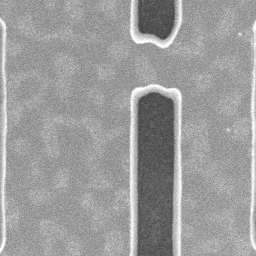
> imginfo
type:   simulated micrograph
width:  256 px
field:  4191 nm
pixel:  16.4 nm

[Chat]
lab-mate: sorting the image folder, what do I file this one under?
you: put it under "one or a few lines or trenches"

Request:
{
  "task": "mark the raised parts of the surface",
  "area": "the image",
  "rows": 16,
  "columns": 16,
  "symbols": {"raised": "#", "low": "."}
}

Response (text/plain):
########...#####
########...#####
################
################
################
################
########...#####
########...#####
########...#####
########...#####
########...#####
########...#####
########...#####
########...#####
########...#####
########...#####